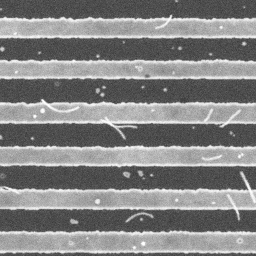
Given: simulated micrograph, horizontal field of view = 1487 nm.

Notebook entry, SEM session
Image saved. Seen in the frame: lines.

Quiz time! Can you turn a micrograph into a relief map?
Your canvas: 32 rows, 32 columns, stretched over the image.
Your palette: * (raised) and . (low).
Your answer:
................................
................................
********************************
********************************
********************************
................................
................................
...........................*....
********************************
********************************
................................
................................
................................
********************************
********************************
.............**............**...
................................
................................
*************.******************
********************************
********************************
................................
................................
................................
********************************
********************************
................................
................................
................................
********************************
********************************
*....***...***....*....*.*.**.**